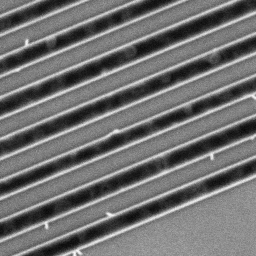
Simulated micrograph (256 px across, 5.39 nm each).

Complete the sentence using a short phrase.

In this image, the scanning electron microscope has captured parallel lines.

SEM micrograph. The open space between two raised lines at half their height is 101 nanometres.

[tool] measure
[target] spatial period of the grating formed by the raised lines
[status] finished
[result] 204 nanometres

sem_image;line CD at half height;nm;106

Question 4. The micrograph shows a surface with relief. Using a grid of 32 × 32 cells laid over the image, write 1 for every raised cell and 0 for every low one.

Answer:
00001111110000001111110000001111
01111110000001111111000000111111
11111000000111111000000111111100
11000000011111100000011111110000
00000011111110000011111110000001
00011111110000001111111000000111
01111111000000111111000000111111
11111000000111111100000011111100
11100000011111100000011111110000
00000011111110000001111110000001
00001111111000001111111000000111
00111111000000111111000000011111
11111100000011111100000011111100
11100000011111110000001111110000
10000001111110000001111110000000
00001111111000000111111000000111
00111111000000111111000000011111
11111100000011111100000011111110
11110000001111100000001111110000
10000001111110000000111111000000
00000111111000000111111000000011
00111111000000011111100000011111
11111100000011111110000001111110
11100000001111110000001111110000
10000001111111000000111111000000
00000111111000000011111100000000
00011111100000011111100000000000
11111110000001111110000000000000
11110000001111110000000000000000
11000000111111000000000000000000
00000111111100000000000000000000
00011111110000000000000000000000